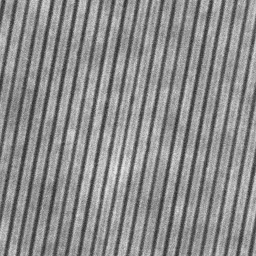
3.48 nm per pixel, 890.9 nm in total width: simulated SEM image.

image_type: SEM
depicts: parallel lines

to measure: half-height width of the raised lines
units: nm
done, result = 24.3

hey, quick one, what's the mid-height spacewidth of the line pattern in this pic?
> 17.1 nm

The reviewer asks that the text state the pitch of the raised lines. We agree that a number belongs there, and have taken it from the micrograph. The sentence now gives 41.8 nm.